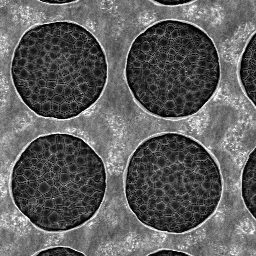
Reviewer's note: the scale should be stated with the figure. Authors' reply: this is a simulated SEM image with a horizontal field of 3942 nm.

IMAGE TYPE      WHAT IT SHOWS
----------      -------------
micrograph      holes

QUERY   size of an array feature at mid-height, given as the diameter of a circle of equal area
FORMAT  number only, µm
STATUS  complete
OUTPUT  1.49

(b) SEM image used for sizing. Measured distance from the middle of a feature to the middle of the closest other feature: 1740 nanometers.